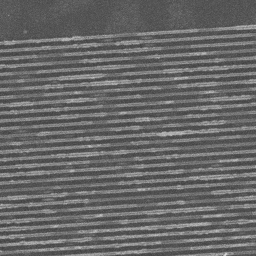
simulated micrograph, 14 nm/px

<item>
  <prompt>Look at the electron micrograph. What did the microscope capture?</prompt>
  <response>parallel lines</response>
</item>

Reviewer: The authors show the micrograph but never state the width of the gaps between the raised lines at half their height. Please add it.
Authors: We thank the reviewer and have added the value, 0.0716 microns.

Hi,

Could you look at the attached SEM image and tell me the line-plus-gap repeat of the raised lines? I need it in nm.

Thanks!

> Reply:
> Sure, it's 108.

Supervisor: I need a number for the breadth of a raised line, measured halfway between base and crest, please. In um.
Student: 0.0366